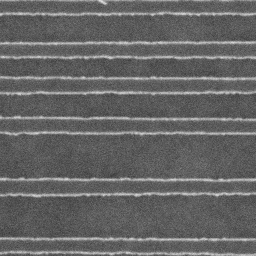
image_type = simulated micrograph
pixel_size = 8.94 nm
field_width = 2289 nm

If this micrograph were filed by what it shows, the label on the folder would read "lines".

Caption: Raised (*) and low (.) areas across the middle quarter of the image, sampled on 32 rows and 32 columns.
................................
................................
................................
**..**..**...........**.........
********************************
********************************
********************************
................................
................................
................................
................................
................................
................................
*****.**********................
********************************
********************************
********************************
...................*............
................................
................................
................................
................................
................................
................................
................................
................................
................................
................................
................................
********************************
********************************
********************************